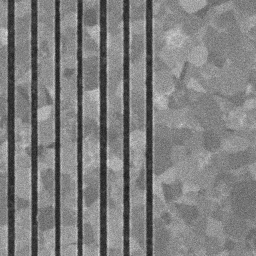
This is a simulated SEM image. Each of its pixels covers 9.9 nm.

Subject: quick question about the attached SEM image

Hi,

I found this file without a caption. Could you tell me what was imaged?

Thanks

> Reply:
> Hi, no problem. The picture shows parallel lines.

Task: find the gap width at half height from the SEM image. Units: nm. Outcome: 78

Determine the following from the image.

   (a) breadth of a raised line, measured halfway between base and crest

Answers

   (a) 156 nm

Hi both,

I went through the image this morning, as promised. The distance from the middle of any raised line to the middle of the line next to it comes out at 227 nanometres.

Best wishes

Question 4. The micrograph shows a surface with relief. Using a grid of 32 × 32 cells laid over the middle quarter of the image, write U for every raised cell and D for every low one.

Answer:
UUUDDUUUUDDUUUDDDUUUDDUUUUUUUUUU
UUUDDUUUUDDUUUDDDUUUDDUUUUUUUUUU
UUUDDUUUUDDUUUUDDUUUDDUUUUUUUUUU
UUUDDUUUUDDUUUDDDUUUDDUUUUUUUUUU
UUUDDUUUUDDUUUDDDUUUDDUUUUUUUUUU
UUUDDUUUUDDUUUDDDUUUDDUUUUUUUUUU
UUUDDUUUUDDUUUUDDUUUDDUUUUUUUUUU
UUUDDUUUUDDUUUDDDUUUDDUUUUUUUUUU
UUUDDUUUUDDUUUDDUUUUDDUUUUUUUUUU
UUUDDUUUUDDUUUDDUUUUDDUUUUUUUUUU
UUUDDUUUUDDUUUUDDUUUDDUUUUUUUUUU
UUUDDUUUUDDUUUUDDUUUDDUUUUUUUUUU
UUUDDUUUUDDUUUDDDUUUDDUUUUUUUUUU
UUUDDUUUUDDUUUUDDUUUDDUUUUUUUUUU
UUUDDUUUUDDUUUDDDUUUDDUUUUUUUUUU
UUUDDUUUUDDUUUDDDUUUDDUUUUUUUUUU
UUUDDUUUUDDUUUDDDUUUDDUUUUUUUUUU
UUUDDUUUUDDUUUDDDUUUDDUUUUUUUUUU
UUUDDUUUUDDUUUUDDUUUDDUUUUUUUUUU
UUUDDUUUUDDUUUUDDUUUDDUUUUUUUUUU
UUUDDUUUUDDUUUUDDUUUDDUUUUUUUUUU
UUUDDUUUUDDUUUUDDUUUDDUUUUUUUUUU
UUUDDUUUUDDUUUUDDUUUDDUUUUUUUUUU
UUUDDUUUUDDUUUUDDUUUDDUUUUUUUUUU
UUUDDUUUUDDUUUUDDUUUDDUUUUUUUUUU
UUUDDUUUUDDUUUUDDUUUDDUUUUUUUUUU
UUUDDUUUUDDUUUUDDUUUDDUUUUUUUUUU
UUUDDUUUUDDUUUUDDUUUDDUUUUUUUUUU
UUUDDUUUUDDUUUUDDUUUDDUUUUUUUUUU
UUUDDUUUUDDUUUUDDUUUDDUUUUUUUUUU
UUUDDUUUUDDUUUUDDUUUDDUUUUUUUUUU
UUUDDUUUUDDUUUUDDUUUDDUUUUUUUUUU